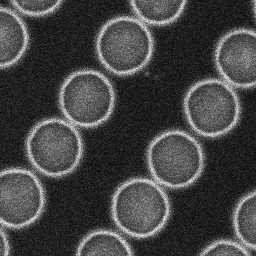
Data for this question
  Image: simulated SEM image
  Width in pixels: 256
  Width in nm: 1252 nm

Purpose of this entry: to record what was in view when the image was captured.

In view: holes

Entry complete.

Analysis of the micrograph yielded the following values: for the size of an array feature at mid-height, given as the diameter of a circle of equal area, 247 nm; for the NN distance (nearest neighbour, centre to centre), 292 nanometres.